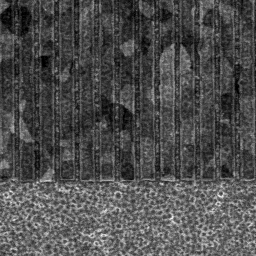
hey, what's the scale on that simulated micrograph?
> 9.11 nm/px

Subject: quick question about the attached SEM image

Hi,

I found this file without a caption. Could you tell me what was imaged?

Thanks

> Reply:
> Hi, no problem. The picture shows parallel lines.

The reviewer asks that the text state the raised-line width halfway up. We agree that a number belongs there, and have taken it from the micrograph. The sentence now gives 121 nanometers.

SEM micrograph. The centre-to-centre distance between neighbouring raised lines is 0.182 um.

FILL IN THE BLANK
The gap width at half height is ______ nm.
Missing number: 56.9